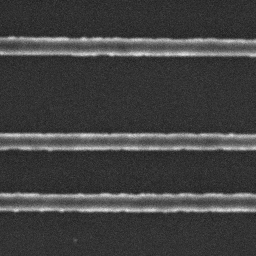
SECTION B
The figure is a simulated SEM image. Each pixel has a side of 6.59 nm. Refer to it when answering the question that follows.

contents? lines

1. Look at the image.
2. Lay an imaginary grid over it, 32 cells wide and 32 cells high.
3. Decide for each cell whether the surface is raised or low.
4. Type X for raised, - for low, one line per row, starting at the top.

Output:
--------------------------------
--------------------------------
--------------------------------
--------------------------------
--------------------------------
XXXXXXXXXXXXXXXXXXXXXXXXXXXXXXXX
XXXXXXXXXXXXXXXXXXXXXXXXXXXXXXXX
--------------------------------
--------------------------------
--------------------------------
--------------------------------
--------------------------------
--------------------------------
--------------------------------
--------------------------------
--------------------------------
--------------------------------
XXXXXXXXXXXXXXXXXXXXXXXXXXXXXXXX
XXXXXXXXXXXXXXXXXXXXXXXXXXXXXXXX
--------------------------------
--------------------------------
--------------------------------
--------------------------------
--------------------------------
XXXXXXXXXXXXXXXXXXXXXXXXXXXXXXXX
XXXXXXXXXXXXXXXXXXXXXXXXXXXXXXXX
--------------------------------
--------------------------------
--------------------------------
--------------------------------
--------------------------------
--------------------------------